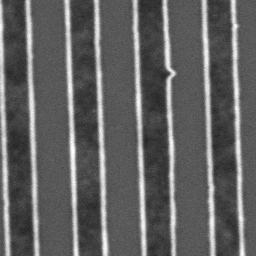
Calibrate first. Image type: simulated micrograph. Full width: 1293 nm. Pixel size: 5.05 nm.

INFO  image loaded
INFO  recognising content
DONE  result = one or a few lines or trenches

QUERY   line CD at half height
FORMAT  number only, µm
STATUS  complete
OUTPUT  0.151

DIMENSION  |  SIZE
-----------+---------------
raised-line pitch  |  345 nanometres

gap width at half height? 193 nm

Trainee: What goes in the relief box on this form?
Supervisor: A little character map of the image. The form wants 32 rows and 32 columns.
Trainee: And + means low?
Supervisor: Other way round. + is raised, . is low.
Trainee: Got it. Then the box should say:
+++.....++++.....++++....++++...
+++.....++++.....++++.....+++...
++++.....+++.....++++.....+++...
++++.....+++.....++++.....+++...
++++....++++.....++++.....+++...
++++.....+++.....++++.....+++...
++++.....+++.....++++.....+++...
++++.....+++.....++++.....+++...
++++.....+++.....++++.....+++...
++++.....+++.....++++.....+++...
++++.....+++.....++++.....+++...
++++.....+++.....++++.....++++..
++++.....+++.....++++.....++++..
++++.....++++....++++.....++++..
++++.....++++....++++.....++++..
++++.....++++....++++.....++++..
++++.....++++.....+++.....++++..
.+++.....++++.....+++.....++++..
.+++.....++++.....+++.....++++..
.+++.....++++.....++++....++++..
.+++.....++++.....++++....++++..
.+++.....++++.....+++.....++++..
.+++.....++++.....+++.....++++..
.+++.....++++.....++++....++++..
.+++.....++++.....+++.....++++..
.+++.....++++.....++++....++++..
.+++.....++++.....++++.....+++..
.+++.....++++.....++++....++++..
.+++.....++++.....++++....++++..
.+++.....++++.....++++.....+++..
.++++.....+++.....++++.....+++..
.++++.....+++.....++++.....+++..